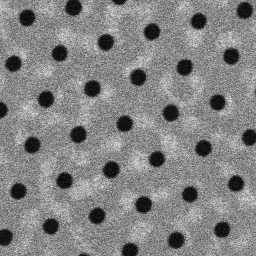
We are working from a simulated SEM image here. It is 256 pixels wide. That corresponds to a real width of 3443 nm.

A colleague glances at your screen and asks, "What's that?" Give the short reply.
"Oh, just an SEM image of a regular array of holes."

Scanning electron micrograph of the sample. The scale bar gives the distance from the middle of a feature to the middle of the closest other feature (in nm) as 637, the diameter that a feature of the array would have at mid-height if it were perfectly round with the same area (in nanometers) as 228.